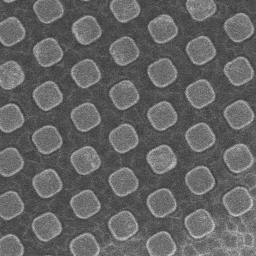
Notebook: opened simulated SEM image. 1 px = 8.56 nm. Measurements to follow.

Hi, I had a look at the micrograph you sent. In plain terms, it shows a regular array of raised bodies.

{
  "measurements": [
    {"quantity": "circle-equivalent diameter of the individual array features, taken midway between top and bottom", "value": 239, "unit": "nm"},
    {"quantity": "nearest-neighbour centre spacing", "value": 370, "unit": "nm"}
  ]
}